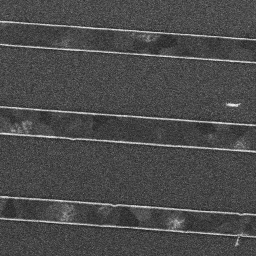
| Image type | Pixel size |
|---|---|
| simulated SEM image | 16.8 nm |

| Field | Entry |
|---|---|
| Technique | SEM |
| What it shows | one or a few lines or trenches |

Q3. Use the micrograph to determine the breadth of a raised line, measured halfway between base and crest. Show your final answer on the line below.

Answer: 395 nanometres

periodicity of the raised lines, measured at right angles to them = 1460 nm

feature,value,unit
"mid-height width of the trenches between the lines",1.04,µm